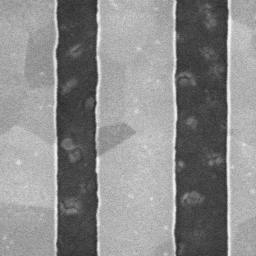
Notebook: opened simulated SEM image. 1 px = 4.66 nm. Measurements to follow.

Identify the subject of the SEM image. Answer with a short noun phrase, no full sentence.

one or a few lines or trenches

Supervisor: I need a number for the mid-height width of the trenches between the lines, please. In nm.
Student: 223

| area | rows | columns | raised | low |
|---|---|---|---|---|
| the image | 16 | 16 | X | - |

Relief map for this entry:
XXXX--XXXXX---XX
XXXX--XXXXX---XX
XXXX--XXXXX---XX
XXX---XXXXX---XX
XXXX--XXXXX---XX
XXXX--XXXXX---XX
XXX---XXXXX---XX
XXX---XXXXX---XX
XXXX--XXXXX---XX
XXXX--XXXXX---XX
XXXX--XXXXX---XX
XXXX--XXXXX---XX
XXXX--XXXXX---XX
XXXX--XXXXX---XX
XXXX--XXXXX---XX
XXXX--XXXXX---XX